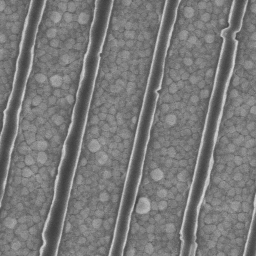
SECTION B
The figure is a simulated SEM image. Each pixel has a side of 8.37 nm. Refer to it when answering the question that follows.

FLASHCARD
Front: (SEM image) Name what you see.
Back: one or a few lines or trenches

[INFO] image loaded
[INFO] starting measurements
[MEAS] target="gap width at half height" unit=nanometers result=438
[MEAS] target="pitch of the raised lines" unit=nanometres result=551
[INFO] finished